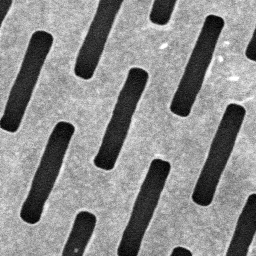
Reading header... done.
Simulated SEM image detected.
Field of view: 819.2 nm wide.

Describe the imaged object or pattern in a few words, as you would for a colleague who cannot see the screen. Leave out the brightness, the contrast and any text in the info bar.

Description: holes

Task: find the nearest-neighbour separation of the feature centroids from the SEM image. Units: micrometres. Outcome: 0.291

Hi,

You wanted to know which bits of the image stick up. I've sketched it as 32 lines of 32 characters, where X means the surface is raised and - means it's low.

--XXXXXXXXXX---XXXX---XXXXXXXXXX
-XXXXXXXXXXX---XXXX---XXXXXXXXXX
XXXXXXXXXXXX--XXXXX--XXXXX--XXXX
XXXXXXXXXXX---XXXXXXXXXXX---XXXX
XXXX---XXXX---XXXXXXXXXXX--XXXX-
XXXX--XXXX---XXXXXXXXXXX---XXXX-
XXX---XXXX---XXXXXXXXXXX---XXXX-
XXX---XXX---XXXXXXXXXXX---XXXXX-
XXX--XXXX---XXXX-XXXXXX---XXXXXX
XX---XXXXX--XXXX---XXXX---XXXXXX
XX---XXXXXXXXXX---XXXX---XXXXXXX
X---XXXXXXXXXXX---XXXX---XXXXXXX
X---XXXXXXXXXXX--XXXX---XXXXXXXX
X--XXXXXXXXXXX---XXXX---XXXX--XX
---XXXXXXXXXXX---XXXXX-XXXXX---X
---XXXX--XXXXX--XXXXXXXXXXX---XX
X-XXXX---XXXX---XXXXXXXXXXX---XX
XXXXXX---XXXX---XXXXXXXXXXX--XXX
XXXXXX--XXXX---XXXXXXXXXXX---XXX
XXXXX---XXXX---XXXXXXXXXXX---XXX
XXXXX---XXXX--XXXXX--XXXXX--XXXX
XXXX---XXXXXXXXXXX---XXXX---XXXX
XXXX---XXXXXXXXXXX---XXXX---XXXX
XXXX---XXXXXXXXXXX--XXXX---XXXXX
XXX---XXXXXXXXXXX---XXXX---XXXX-
XXX---XXXXXXXXXXX---XXXXX-XXXXX-
XXX--XXXXX-XXXXX---XXXXXXXXXXX--
XXX--XXXX---XXXX---XXXXXXXXXXX--
XXXXXXXXX---XXXX--XXXXXXXXXXX---
XXXXXXXXX--XXXX---XXXXXXXXXXX---
XXXXXXXX---XXXX---XXXXXXXXXXX--X
XXXXXXXX---XXXX--XXXXX--XXXX---X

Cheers